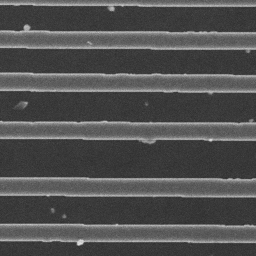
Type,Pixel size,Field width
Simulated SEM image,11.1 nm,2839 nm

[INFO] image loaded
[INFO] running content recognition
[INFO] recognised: lines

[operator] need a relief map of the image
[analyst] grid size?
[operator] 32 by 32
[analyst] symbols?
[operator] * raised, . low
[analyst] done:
********************************
................................
................................
................................
********************************
********************************
................................
................................
................................
********************************
********************************
................................
................................
................................
................................
********************************
********************************
..................**.....*******
................................
................................
................................
................................
********************************
********************************
......................**********
................................
................................
................................
********************************
********************************
................................
................................